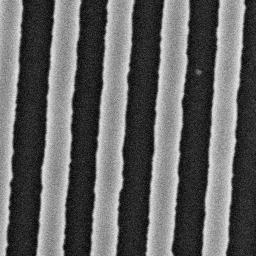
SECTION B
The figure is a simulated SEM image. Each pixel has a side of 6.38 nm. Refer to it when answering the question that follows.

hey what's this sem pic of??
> lines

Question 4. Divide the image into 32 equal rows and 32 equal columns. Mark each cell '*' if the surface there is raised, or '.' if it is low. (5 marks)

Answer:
***....***....***....***....**..
***....***....***...****...***..
***....***...***....****...***..
***....***...***....***....***..
***....***...***....***....***..
**....****...***....***....***..
**....***....***....***....***..
**....****...***....***....***..
**....***....***....***....***..
**....***....***....***....***..
**....***....***....***....***..
**....***....***....***....***..
**....***....***....***....***..
**....***....***....***....***..
**....***....***....***....***..
**....***...****...****...***...
**....***...****...****...***...
**....***...***....***....***...
**....***...***....***....***...
*.....***...***....***....***...
*....****...***....***....***...
*....****...***....***....***...
*....****...***....***....***...
*....***....***....***....***...
*....***....***....***....***...
*....***....***....***....***...
*....***....***....***....***...
*....***....***....***....***...
*....***....***....***...****...
*....***....***...****...****...
*....***....***...****...***....
*....***...***....***....***....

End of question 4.